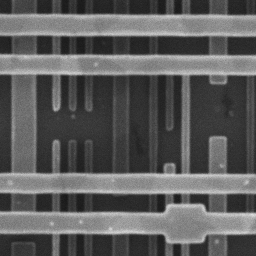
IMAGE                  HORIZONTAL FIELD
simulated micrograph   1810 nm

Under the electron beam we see wiring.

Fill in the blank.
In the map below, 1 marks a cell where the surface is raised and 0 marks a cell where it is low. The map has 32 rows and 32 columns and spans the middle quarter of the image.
11111111111111111111111111111111
11111111111111111111111111111111
11111111111111111111111111111111
00000000000000000000000000000000
00000000000000000000000000000000
00000000000000000000000000000000
00000000000000000000000000000000
00000000000000000000000000000000
00000000000000000000000000000000
00000000000000000000000000000000
00000000000000000000000000000000
00000000000000000000000000000000
00000000000000000000000000000000
00000000000000000000000000000000
00000000000000000000000000000000
00000000000000000000000000000000
00000000000000000000000000000000
00000000000000000000000000000000
00000000000000000000000000000000
00000000000000000000000000000000
00000000000000000000000000000000
00000000000000000000000000000000
00000000000000000000000000000000
00000000000000000000000000000000
00000000000000000000000000000000
00000000000000000000000000000000
00000000000000000000000000000000
00000000000000000000000000000000
11111111111111111111111111111111
11111111111111111111111111111111
11111111111111111111111111111111
11111111111111111111111111111111